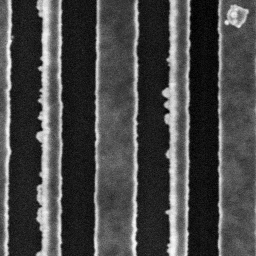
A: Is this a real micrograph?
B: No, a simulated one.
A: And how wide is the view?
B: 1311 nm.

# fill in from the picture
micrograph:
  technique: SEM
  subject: lines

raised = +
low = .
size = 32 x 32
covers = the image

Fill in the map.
+....+++....+++++....+++...+++++
+....+++....+++++....+++...+++++
+....+++....+++++....+++...+++++
+....+++....+++++....+++...+++++
+....+++....+++++....+++...+++++
+....+++....+++++....+++...+++++
+....+++....+++++....+++...+++++
+....+++....+++++....+++...+++++
+....+++....+++++....+++...+++++
+....+++....+++++....+++...+++++
+....+++....+++++....+++...+++++
+....+++....+++++....+++...+++++
+....+++....+++++....+++...+++++
+....+++....+++++....+++...+++++
+....+++....+++++....+++...+++++
+....+++....+++++....+++...+++++
+....+++....+++++....+++...+++++
+....+++....+++++....+++...+++++
+....+++....+++++....+++...+++++
+....+++....+++++....+++...+++++
+....+++....+++++....+++...+++++
+....+++....+++++....+++...+++++
+....+++....+++++....+++...+++++
+....+++....+++++....+++...+++++
+....+++....+++++....+++...+++++
+....+++....+++++....+++...+++++
+....+++....+++++....+++...+++++
+....+++....+++++....++....+++++
+....+++....+++++....++....+++++
+....+++....+++++....+++...+++++
+....+++....+++++....++....+++++
+....+++....+++++....++....+++++